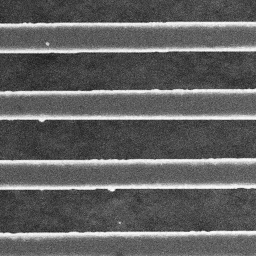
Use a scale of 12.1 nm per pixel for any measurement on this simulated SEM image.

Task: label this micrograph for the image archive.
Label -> lines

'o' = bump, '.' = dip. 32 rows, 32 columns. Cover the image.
................................
................................
................................
oooooooooooooooooooooooooooooooo
oooooooooooooooooooooooooooooooo
oooooooooooooooooooooooooooooooo
oooooo..........................
................................
................................
................................
................................
o.oooooooooooooooooooooooooooooo
oooooooooooooooooooooooooooooooo
oooooooooooooooooooooooooooooooo
oooooooooooooooooooooooooooooooo
................................
................................
................................
................................
................................
oooooooooooooooooooooooooooooooo
oooooooooooooooooooooooooooooooo
oooooooooooooooooooooooooooooooo
oooooooooooooooooooooooooo......
................................
................................
................................
................................
................................
oooooooooooooooooooooooooooooooo
oooooooooooooooooooooooooooooooo
oooooooooooooooooooooooooooooooo